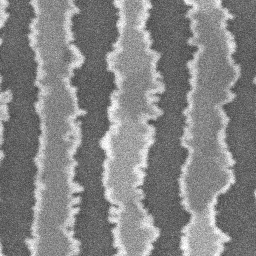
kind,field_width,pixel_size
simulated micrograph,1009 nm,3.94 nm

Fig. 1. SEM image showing one or a few lines or trenches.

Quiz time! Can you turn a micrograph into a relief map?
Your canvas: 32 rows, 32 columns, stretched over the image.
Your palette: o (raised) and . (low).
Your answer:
o...ooooo......oooo.....ooo.....
o...ooooo......ooo......oooo....
o...ooooo......ooo......oooo....
....ooooo......ooo......oooo....
....ooooo......ooo......ooooo...
....ooooo......oooo.....ooooo...
....oooooo....oooooo.....oooo...
.....ooooo...ooooooo....ooooo...
.....oooo.....ooooo.....oooooo..
.....oooo.....oooooo....oooooo..
.....oooo......ooooo....ooooo...
.....oooo......ooooo....ooooo...
o....ooooo....ooooo.....ooooo...
o....ooooo....oooooo...ooooo....
o....ooooo....oooooo...ooooo....
.....oooo.....oooo.....ooooo....
.....ooooo....ooooo....ooooo....
.....ooooo...oooooo....ooooo....
.....ooooo...ooooo.....ooooo....
.....oooo.....oooo......ooooo...
.....oooo....ooooo.....oooooo...
.....oooo....ooooo.....oooooo...
.....oooo....ooooo....ooooooo...
.....ooooo...oooo......ooooo....
.....oooo....ooooo.....oooo.....
.....oooo......ooo.....oooo.....
....ooooo.....oooo......ooo.....
....ooooo.....ooooo.....ooo.....
....ooooo.....ooooo....oooo.....
....ooooo.....oooooo...ooooo....
....oooooo.....oooo....ooooo....
....oooooo.....oooo....ooooo....